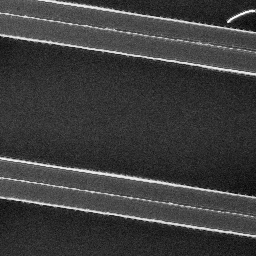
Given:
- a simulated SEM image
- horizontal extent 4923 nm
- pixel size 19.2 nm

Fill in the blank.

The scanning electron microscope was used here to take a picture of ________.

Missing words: lines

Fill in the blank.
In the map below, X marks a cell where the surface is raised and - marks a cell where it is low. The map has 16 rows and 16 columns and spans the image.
XXXXXX----------
XXXXXXXXXXXX----
--XXXXXXXXXXXXXX
--------XXXXXXXX
---------------X
----------------
----------------
----------------
----------------
----------------
XXXX------------
XXXXXXXXXX------
-XXXXXXXXXXXXXXX
--------XXXXXXXX
--------------XX
----------------